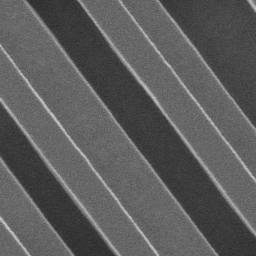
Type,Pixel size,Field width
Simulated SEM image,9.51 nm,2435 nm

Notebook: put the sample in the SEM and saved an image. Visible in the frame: lines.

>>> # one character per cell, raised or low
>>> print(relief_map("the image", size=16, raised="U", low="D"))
UUDDDUUUUUDDDDDD
UUUDDDUUUUUDDDDD
UUUDDDDUUUUUDDDD
UUUUDDDUUUUUUDDD
UUUUUDDDUUUUUDDD
UUUUUUDDDUUUUUDD
UUUUUUDDDDUUUUUD
DUUUUUUDDDDUUUUU
DDUUUUUUDDDUUUUU
DDUUUUUUUDDDUUUU
DDDUUUUUUDDDDUUU
UDDDUUUUUUDDDDUU
UUDDDUUUUUUDDDUU
UUUDDUUUUUUUDDDU
UUUDDDUUUUUUDDDD
UUUUDDDUUUUUUDDD